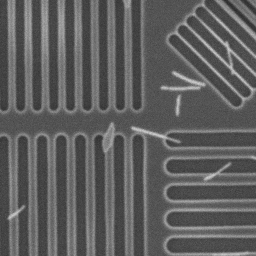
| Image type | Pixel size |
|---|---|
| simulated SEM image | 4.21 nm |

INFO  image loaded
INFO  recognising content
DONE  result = groups of lines, slits or small figures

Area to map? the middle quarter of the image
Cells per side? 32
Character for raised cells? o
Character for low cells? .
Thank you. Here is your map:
...o...oo..oo..oo..ooooooooooooo
...o...oo..oo..oo..ooooooooooooo
...o...oo..oo..oo..ooooooooooooo
...o...oo..oo..oo..ooooooooooooo
...o...oo..oo..oo..ooooooooooooo
...o...oo..oo..oo..ooooooooooooo
...o...oo..oo..oo..ooooooooooooo
...oo..oo..oo..oo..ooooooooooooo
...oo..oo..oo..oo..ooooooooooooo
...oo..oo..oo..oo..ooooooooooooo
...oo..oo..oo..oo..ooooooooooooo
o..oo..oo..oo..ooo.ooooooooooooo
oooooooooooooooooooooooooooooooo
oooooooooooooooooooooooooooooooo
oooooooooooooooooooooooooooooooo
oooooooooooooooooooooooooooooooo
oooooooooooooooooooooooooooooooo
oooooooooooooooooo.ooooooo......
.oo..ooo..oo...oo...oooooo......
.o....o...oo...oo...ooooo.......
.oo...o...oo...oo...oooooo......
.oo...o...oo...oo...oooooooooooo
.oo...o...oo...oo...oooooooooooo
.oo..oo...oo...oo...oooooooooooo
.oo..oo...oo...oo...oooooo......
.oo..oo...oo...oo...ooooo.......
.oo...o...oo...oo...oooooo......
.oo...o...oo...oo...ooooooo.....
.oo...oo..oo...oo...oooooooooooo
.oo...oo..oo...oo...oooooooooooo
.oo...oo..oo...oo...oooooo......
.oo...oo..oo...oo...oooooo......